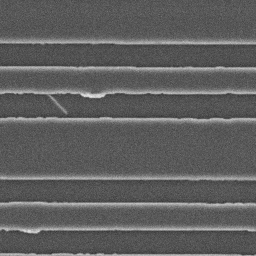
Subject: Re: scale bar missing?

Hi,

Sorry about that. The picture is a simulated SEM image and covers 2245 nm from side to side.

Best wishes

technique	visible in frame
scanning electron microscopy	lines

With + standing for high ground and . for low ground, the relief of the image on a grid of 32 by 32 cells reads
++++++++++++++++++++++++++++++++
++++++++++++++++++++++++++++++++
++++++++++++++++++++++++++++++++
++++++++++++++++++++++++++++++++
++++++++++++++++++++++++++++++++
................................
................................
................................
+++++++++++++++++..........+....
++++++++++++++++++++++++++++++++
++++++++++++++++++++++++++++++++
++++++++++++++++++++++++++++++++
................................
................................
................................
++++++++++++++++++++++++++++++++
++++++++++++++++++++++++++++++++
++++++++++++++++++++++++++++++++
++++++++++++++++++++++++++++++++
++++++++++++++++++++++++++++++++
++++++++++++++++++++++++++++++++
++++++++++++++++++++++++++++++++
................................
................................
................................
++++++++++++++++++++++++++..++++
++++++++++++++++++++++++++++++++
++++++++++++++++++++++++++++++++
++++++++++++++++++++++++++++++++
................................
................................
................................